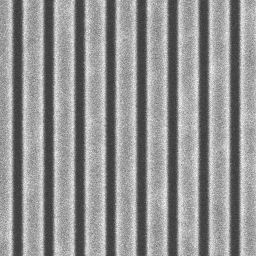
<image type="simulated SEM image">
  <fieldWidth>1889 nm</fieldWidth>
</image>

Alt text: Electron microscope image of parallel lines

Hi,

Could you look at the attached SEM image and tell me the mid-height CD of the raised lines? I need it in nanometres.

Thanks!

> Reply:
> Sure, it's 153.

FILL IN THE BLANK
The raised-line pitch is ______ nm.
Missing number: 229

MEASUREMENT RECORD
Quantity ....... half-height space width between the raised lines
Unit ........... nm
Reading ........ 76.6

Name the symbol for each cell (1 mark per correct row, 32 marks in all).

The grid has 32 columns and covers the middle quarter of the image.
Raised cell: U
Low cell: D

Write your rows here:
UUUDDUUUUUDDDUUUUUDDDUUUUUDDDUUU
UUUDDUUUUUDDDUUUUUDDDUUUUUDDDUUU
UUUDDUUUUUDDDUUUUUDDDUUUUUDDDUUU
UUUDDUUUUUDDDUUUUUDDDUUUUUDDDUUU
UUUDDUUUUUDDDUUUUUDDDUUUUUDDDUUU
UUUDDUUUUUDDDUUUUUDDDUUUUUDDDUUU
UUUDDUUUUUDDDUUUUUDDDUUUUUDDDUUU
UUUDDUUUUUDDDUUUUUDDDUUUUUDDDUUU
UUUDDUUUUUDDDUUUUUDDDUUUUUDDDUUU
UUUDDUUUUUDDDUUUUUDDDUUUUUDDDUUU
UUUDDUUUUUDDDUUUUUDDDUUUUUDDDUUU
UUUDDUUUUUDDDUUUUUDDDUUUUUDDDUUU
UUUDDUUUUUDDDUUUUUDDDUUUUUDDDUUU
UUUDDUUUUUDDDUUUUUDDDUUUUUDDDUUU
UUUDDUUUUUDDDUUUUUDDDUUUUUDDDUUU
UUUDDUUUUUDDDUUUUUDDDUUUUUDDDUUU
UUUDDUUUUUDDDUUUUUDDDUUUUUDDDUUU
UUUDDUUUUUDDDUUUUUDDDUUUUUDDDUUU
UUUDDUUUUUDDDUUUUUDDDUUUUUDDDUUU
UUUDDUUUUUDDDUUUUUDDDUUUUUDDDUUU
UUUDDUUUUUDDDUUUUUDDDUUUUUDDDUUU
UUUDDUUUUUDDDUUUUUDDDUUUUUDDDUUU
UUUDDUUUUUDDDUUUUUDDDUUUUUDDDUUU
UUUDDUUUUUDDDUUUUUDDDUUUUUDDDUUU
UUUDDUUUUUDDDUUUUUDDDUUUUUDDDUUU
UUUDDUUUUUDDDUUUUUDDDUUUUUDDDUUU
UUUDDUUUUUDDDUUUUUDDDUUUUUDDDUUU
UUUDDUUUUUDDDUUUUUDDDUUUUUDDDUUU
UUUDDUUUUUDDDUUUUUDDDUUUUUDDDUUU
UUUDDUUUUUDDDUUUUUDDDUUUUUDDDUUU
UUUDDUUUUUDDDUUUUUDDDUUUUUDDDUUU
UUUDDUUUUUDDDUUUUUDDDUUUUUDDDUUU